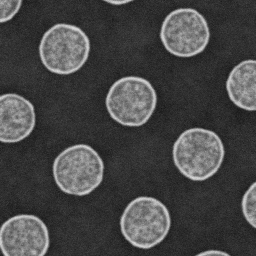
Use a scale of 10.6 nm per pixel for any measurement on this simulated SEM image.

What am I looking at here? raised bodies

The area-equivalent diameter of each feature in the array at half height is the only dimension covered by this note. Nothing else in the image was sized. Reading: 508 nanometres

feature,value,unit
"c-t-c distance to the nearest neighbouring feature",899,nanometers